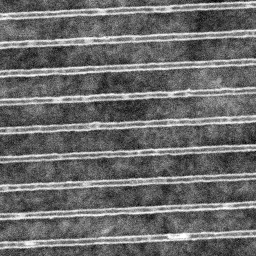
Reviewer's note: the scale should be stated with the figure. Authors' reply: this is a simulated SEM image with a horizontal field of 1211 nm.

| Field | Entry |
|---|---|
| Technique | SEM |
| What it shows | parallel lines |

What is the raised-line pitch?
135 nm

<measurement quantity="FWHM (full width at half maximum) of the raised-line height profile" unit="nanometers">24.8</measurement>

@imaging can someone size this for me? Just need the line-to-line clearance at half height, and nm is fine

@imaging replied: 108